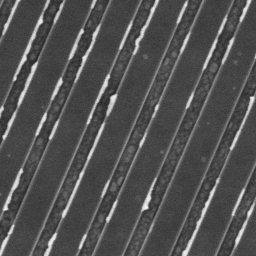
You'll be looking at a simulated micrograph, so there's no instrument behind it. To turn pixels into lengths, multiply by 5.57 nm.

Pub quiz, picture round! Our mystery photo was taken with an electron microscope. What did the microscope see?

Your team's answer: parallel lines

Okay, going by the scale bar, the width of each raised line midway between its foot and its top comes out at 166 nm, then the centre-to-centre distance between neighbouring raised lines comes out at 0.237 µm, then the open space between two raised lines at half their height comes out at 71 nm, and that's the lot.